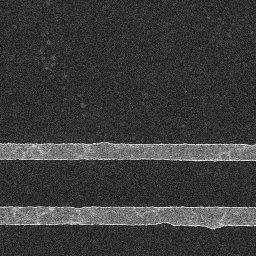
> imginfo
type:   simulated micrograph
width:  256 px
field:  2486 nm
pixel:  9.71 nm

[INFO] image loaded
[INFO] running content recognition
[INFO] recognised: one or a few lines or trenches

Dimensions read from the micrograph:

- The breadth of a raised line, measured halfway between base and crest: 16.6 pixels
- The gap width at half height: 47.5 pixels